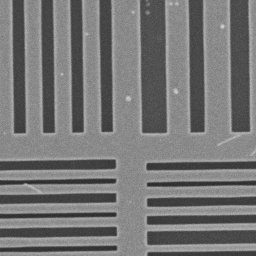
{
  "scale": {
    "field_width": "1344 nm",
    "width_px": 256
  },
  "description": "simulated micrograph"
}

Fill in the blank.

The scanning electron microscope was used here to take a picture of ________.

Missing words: groups of lines, slits or small figures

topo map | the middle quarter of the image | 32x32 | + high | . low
++...++++...+++++++.......+++++.
++...++++...+++++++.......+++++.
++...++++...+++++++.......+++++.
++...++++...+++++++.......+++++.
++...++++...+++++++.......+++++.
++...++++...+++++++.......+++++.
++...++++...+++++++.......+++++.
++...++++...+++++++.......+++++.
++...++++...+++++++.......+++++.
++...++++...+++++++.......+++++.
++...++++...+++++++.......+++++.
++...++++...+++++++.......+++++.
++...++++...+++++++.......+++++.
++...++++...+++++++.......+++++.
++...++++...+++++++.......+++++.
++...++++...+++++++.......+++++.
++...++++...+++++++.......+++++.
++++++++++++++++++++++++++++++++
++++++++++++++++++++++++++++++++
++++++++++++++++++++++++++++++++
++++++++++++++++++++++++++++++++
++++++++++++++++++++++++++++++++
++++++++++++++++++++++++++++++++
++++++++++++++++++++++++++++++++
.............++++++++++++++.....
.............++++++++...........
..........+++++++++++...........
++++++++++++++++++++++++++++++++
++++++.......+++++++++++++++++++
.............++++++++++++.......
+++++++++++++++++++++...........
++++++++++++++++++++++++++++++++